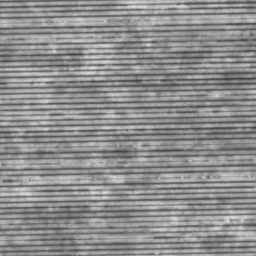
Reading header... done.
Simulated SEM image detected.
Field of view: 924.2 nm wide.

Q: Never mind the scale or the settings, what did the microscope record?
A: parallel lines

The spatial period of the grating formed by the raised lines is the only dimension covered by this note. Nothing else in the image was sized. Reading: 19.6 nm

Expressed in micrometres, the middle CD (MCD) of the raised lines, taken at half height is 0.014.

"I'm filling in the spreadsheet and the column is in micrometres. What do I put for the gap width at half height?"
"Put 0.0068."